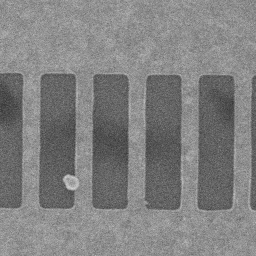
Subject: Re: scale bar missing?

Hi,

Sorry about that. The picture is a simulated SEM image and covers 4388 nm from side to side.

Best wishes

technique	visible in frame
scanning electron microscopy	groups of lines, slits or small figures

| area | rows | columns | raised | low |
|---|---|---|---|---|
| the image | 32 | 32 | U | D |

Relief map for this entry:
UUUUUUUUUUUUUUUUUUUUUUUUUUUUUUUU
UUUUUUUUUUUUUUUUUUUUUUUUUUUUUUUU
UUUUUUUUUUUUUUUUUUUUUUUUUUUUUUUU
UUUUUUUUUUUUUUUUUUUUUUUUUUUUUUUU
UUUUUUUUUUUUUUUUUUUUUUUUUUUUUUUU
UUUUUUUUUUUUUUUUUUUUUUUUUUUUUUUU
UUUUUUUUUUUUUUUUUUUUUUUUUUUUUUUU
UUUUUUUUUUUUUUUUUUUUUUUUUUUUUUUU
UUUUUUUUUUUUUUUUUUUUUUUUUUUUUUUU
DDDUUDDDDUUUDDDDUUUDDDUUUDDDDUUU
DDDUUDDDDDUUDDDDUUDDDDDUUDDDDUUD
DDDUUDDDDDUUDDDDUUDDDDDUUDDDDUUD
DDDUUDDDDDUUDDDDUUDDDDDUUDDDDUUD
DDDUUDDDDDUUDDDDUUDDDDDUUDDDDUUD
DDDUUDDDDDUDDDDDUUDDDDDUUDDDDUUD
DDDUUDDDDDUDDDDDUUDDDDDUUDDDDUUD
DDDUUDDDDDUDDDDDUUDDDDDUUDDDDUUD
DDDUUDDDDDUDDDDDUUDDDDDUUDDDDUUD
DDDUUDDDDDUDDDDDUUDDDDDUUDDDDUUD
DDDUUDDDDDUDDDDDUUDDDDDUUDDDDUUD
DDDUUDDDDDUDDDDDUUDDDDDUUDDDDUUD
DDDUUDDDDDUDDDDDUUDDDDDUUDDDDUUD
DDDUUDDDUUUDDDDDUUDDDDDUUDDDDUUD
DDDUUDDDDUUDDDDDUUDDDDDUUDDDDUUD
DDDUUDDDDUUDDDDDUUDDDDDUUDDDDUUD
DDDUUDDDDUUDDDDDUUDDDDDUUDDDDUUD
UUUUUUUUUUUUUUUUUUUUUUUUUUUUUUUU
UUUUUUUUUUUUUUUUUUUUUUUUUUUUUUUU
UUUUUUUUUUUUUUUUUUUUUUUUUUUUUUUU
UUUUUUUUUUUUUUUUUUUUUUUUUUUUUUUU
UUUUUUUUUUUUUUUUUUUUUUUUUUUUUUUU
UUUUUUUUUUUUUUUUUUUUUUUUUUUUUUUU